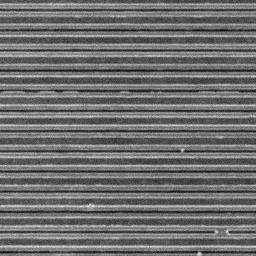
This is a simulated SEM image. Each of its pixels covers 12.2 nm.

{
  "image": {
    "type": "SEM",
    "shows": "parallel lines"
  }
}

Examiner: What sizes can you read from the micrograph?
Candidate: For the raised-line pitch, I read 123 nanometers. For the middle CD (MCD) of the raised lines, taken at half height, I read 54.8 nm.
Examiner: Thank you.